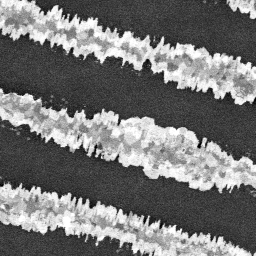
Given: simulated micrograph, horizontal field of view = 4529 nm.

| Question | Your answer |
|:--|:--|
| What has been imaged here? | one or a few lines or trenches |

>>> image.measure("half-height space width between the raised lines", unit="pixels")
59.2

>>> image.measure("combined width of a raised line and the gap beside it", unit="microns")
1.54